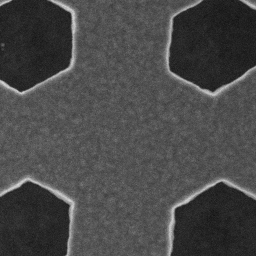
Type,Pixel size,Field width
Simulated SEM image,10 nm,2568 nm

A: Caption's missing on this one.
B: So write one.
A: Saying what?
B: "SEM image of holes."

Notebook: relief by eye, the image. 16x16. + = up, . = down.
....++++++++....
....+++++++.....
.....++++++.....
.....++++++.....
....+++++++....+
+.+++++++++++.++
++++++++++++++++
++++++++++++++++
++++++++++++++++
++++++++++++++++
++++++++++++++++
+.++++++++++++++
....++++++++....
....+++++++.....
....+++++++.....
....+++++++.....